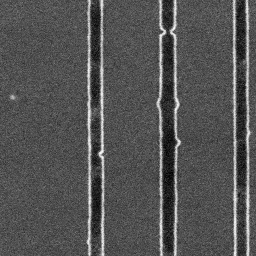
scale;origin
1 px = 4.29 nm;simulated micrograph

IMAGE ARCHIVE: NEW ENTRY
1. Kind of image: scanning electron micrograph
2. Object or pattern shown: one or a few lines or trenches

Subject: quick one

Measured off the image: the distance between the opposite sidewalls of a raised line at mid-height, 14.8 px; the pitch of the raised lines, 312 nm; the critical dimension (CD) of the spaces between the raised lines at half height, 0.249 µm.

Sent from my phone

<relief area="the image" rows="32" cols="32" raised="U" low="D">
DDDDDDDDDDDUUDDDDDDDUUDDDDDDDUUD
DDDDDDDDDDDUUDDDDDDDUUDDDDDDDUUD
DDDDDDDDDDDUUDDDDDDDUUDDDDDDDUUD
DDDDDDDDDDDUUDDDDDDDUUDDDDDDDUUD
DDDDDDDDDDDUUDDDDDDDUUDDDDDDDUUD
DDDDDDDDDDDUUDDDDDDDUUDDDDDDDUUD
DDDDDDDDDDDUUDDDDDDDUUDDDDDDDUUD
DDDDDDDDDDDUUDDDDDDDUUDDDDDDDUUD
DDDDDDDDDDDUUDDDDDDDUUDDDDDDDUUD
DDDDDDDDDDDUUDDDDDDDUUDDDDDDDUUD
DDDDDDDDDDDUUDDDDDDDUUDDDDDDDUUD
DDDDDDDDDDDUUDDDDDDDUUDDDDDDDUUD
DDDDDDDDDDDUUDDDDDDDUUDDDDDDDUUD
DDDDDDDDDDDUUDDDDDDDUUDDDDDDDUUD
DDDDDDDDDDDUUDDDDDDDUUDDDDDDDUUD
DDDDDDDDDDDUUDDDDDDDUUDDDDDDDUUD
DDDDDDDDDDDUUDDDDDDDUUDDDDDDDUUD
DDDDDDDDDDDUUDDDDDDDUUDDDDDDDUUD
DDDDDDDDDDDUUDDDDDDDUUDDDDDDDUUD
DDDDDDDDDDDUUDDDDDDDUUDDDDDDDUUD
DDDDDDDDDDDUUDDDDDDDUUDDDDDDDUUD
DDDDDDDDDDDUUDDDDDDDUUDDDDDDDUUD
DDDDDDDDDDDUUDDDDDDDUUDDDDDDDUUD
DDDDDDDDDDDUUDDDDDDDUUDDDDDDDUUD
DDDDDDDDDDDUUDDDDDDDUUDDDDDDDUUD
DDDDDDDDDDDUUDDDDDDDUUDDDDDDDUUD
DDDDDDDDDDDUUDDDDDDDUUDDDDDDDUUD
DDDDDDDDDDDUUDDDDDDDUUDDDDDDDUUD
DDDDDDDDDDDUUDDDDDDDUUDDDDDDDUUD
DDDDDDDDDDDUUDDDDDDDUUDDDDDDDUUD
DDDDDDDDDDDUUDDDDDDDUUDDDDDDDUUD
DDDDDDDDDDDUUDDDDDDDUUDDDDDDDUUD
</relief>